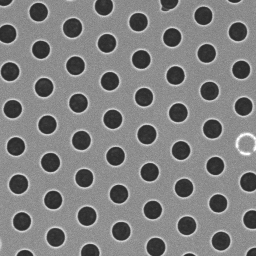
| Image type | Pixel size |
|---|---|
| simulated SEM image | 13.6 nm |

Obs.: a regular array of holes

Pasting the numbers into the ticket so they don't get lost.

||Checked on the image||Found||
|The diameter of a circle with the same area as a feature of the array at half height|256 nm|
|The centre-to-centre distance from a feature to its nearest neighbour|509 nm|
